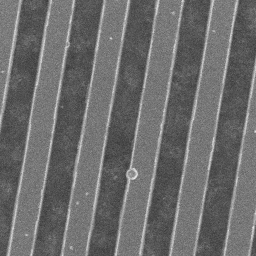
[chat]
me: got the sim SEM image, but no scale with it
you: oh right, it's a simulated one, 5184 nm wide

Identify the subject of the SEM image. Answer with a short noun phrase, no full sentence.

parallel lines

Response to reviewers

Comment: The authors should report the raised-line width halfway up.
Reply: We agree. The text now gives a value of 0.524 µm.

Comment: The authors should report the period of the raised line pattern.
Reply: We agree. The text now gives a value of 1.08 µm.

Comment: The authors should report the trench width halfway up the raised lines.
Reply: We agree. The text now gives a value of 564 nm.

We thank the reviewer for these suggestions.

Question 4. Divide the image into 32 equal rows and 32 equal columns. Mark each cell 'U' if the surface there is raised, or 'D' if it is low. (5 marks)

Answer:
UUUDDDUUUDDDDUUUDDDDUUUDDDUUUUDD
UUDDDDUUUDDDDUUUDDDUUUUDDDUUUUDD
UUDDDDUUUDDDDUUUDDDUUUUDDDUUUDDD
UUDDDDUUUDDDUUUUDDDUUUDDDDUUUDDD
UUDDDDUUUDDDUUUDDDDUUUDDDDUUUDDD
UUDDDUUUUDDDUUUDDDDUUUDDDDUUUDDD
UUDDDUUUDDDDUUUDDDDUUUDDDDUUUDDD
UDDDDUUUDDDDUUUDDDUUUUDDDUUUUDDD
UDDDDUUUDDDDUUUDDDUUUUDDDUUUDDDD
UDDDDUUUDDDUUUUDDDUUUDDDDUUUDDDD
UDDDDUUUDDDUUUDDDDUUUDDDDUUUDDDU
UDDDUUUDDDDUUUDDDDUUUDDDDUUUDDDU
UDDDUUUDDDDUUUDDDDUUUDDDUUUUDDDU
DDDDUUUDDDDUUUDDDUUUUDDDUUUUDDDU
DDDDUUUDDDDUUUDDDUUUUDDDUUUDDDDU
DDDDUUUDDDUUUUDDDUUUDDDDUUUDDDDU
DDDUUUUDDDUUUDDDDUUUDDDDUUUDDDUU
DDDUUUUDDDUUUDDDDUUUDDDDUUUDDDUU
DDDUUUDDDDUUUDDDDUUUDDDUUUUDDDUU
DDDUUUDDDDUUUDDDDUUUDDDUUUUDDDUU
DDDUUUDDDDUUUDDDUUUUDDDUUUDDDDUU
DDDUUUDDDUUUUDDDUUUDDDDUUUDDDDUU
DDUUUUDDDUUUDDDDUUUDDDDUUUDDDUUU
DDUUUDDDDUUUDDDDUUUDDDDUUUDDDUUU
DDUUUDDDDUUUDDDDUUUDDDUUUUDDDUUU
DDUUUDDDDUUUDDDUUUUDDDUUUDDDDUUU
DDUUUDDDDUUUDDDUUUUDDDUUUDDDDUUU
DDUUUDDDUUUUDDDUUUDDDDUUUDDDDUUU
DUUUUDDDUUUDDDDUUUDDDDUUUDDDUUUU
DUUUDDDDUUUDDDDUUUDDDDUUUDDDUUUU
DUUUDDDDUUUDDDDUUUDDDUUUUDDDUUUU
DUUUDDDDUUUDDDUUUUDDDUUUDDDDUUUD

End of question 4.